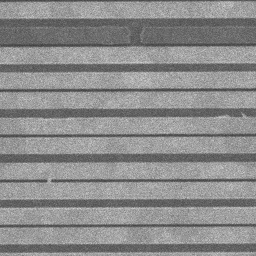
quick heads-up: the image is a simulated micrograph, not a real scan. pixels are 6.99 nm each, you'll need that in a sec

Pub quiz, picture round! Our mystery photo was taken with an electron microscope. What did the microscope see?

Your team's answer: parallel lines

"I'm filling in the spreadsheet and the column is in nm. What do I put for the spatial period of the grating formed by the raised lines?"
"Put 158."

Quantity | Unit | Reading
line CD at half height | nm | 114